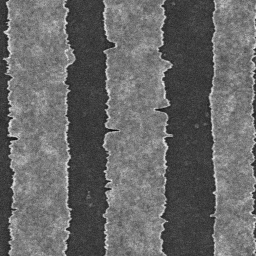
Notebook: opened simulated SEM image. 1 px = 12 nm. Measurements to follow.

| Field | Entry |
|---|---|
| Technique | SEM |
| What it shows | one or a few lines or trenches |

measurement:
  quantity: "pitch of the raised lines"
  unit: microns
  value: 1.16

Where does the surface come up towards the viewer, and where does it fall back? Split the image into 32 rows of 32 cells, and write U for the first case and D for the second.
DUUUUUUUDDDDDUUUUUUUDDDDDDDUUUUU
DUUUUUUUDDDDDUUUUUUUUDDDDDDUUUUU
DUUUUUUUDDDDDUUUUUUUUDDDDDDUUUUU
DUUUUUUUDDDDDUUUUUUUDDDDDDDUUUUU
DUUUUUUUDDDDDUUUUUUUDDDDDDDUUUUU
DUUUUUUUUDDDDDUUUUUUDDDDDDDUUUUU
DUUUUUUUUDDDDUUUUUUUDDDDDDDUUUUU
DUUUUUUUUDDDDUUUUUUUUDDDDDDUUUUU
DUUUUUUUDDDDDUUUUUUUUDDDDDDUUUUU
DUUUUUUUDDDDDUUUUUUUDDDDDDDUUUUU
DUUUUUUUDDDDDUUUUUUUDDDDDDDUUUUU
DUUUUUUUDDDDDUUUUUUUUDDDDDUUUUUU
DUUUUUUUDDDDDDUUUUUUUDDDDDUUUUUU
DUUUUUUUDDDDDUUUUUUUDDDDDDUUUUUU
DUUUUUUUDDDDDUUUUUUUUDDDDDUUUUUU
DUUUUUUUDDDDDUUUUUUUUDDDDDDUUUUU
DUUUUUUUDDDDDDUUUUUUUDDDDDDUUUUU
DDUUUUUUDDDDDUUUUUUUUDDDDDDUUUUU
DUUUUUUUUDDDDUUUUUUUUDDDDDDUUUUU
DUUUUUUUUDDDDDUUUUUUUDDDDDDUUUUU
DUUUUUUUDDDDDUUUUUUUUDDDDDDUUUUU
DDUUUUUUDDDDDUUUUUUUUDDDDDDUUUUU
DDUUUUUUDDDDDUUUUUUUUDDDDDDUUUUU
DDUUUUUUDDDDDDUUUUUUUDDDDDDUUUUU
DDUUUUUUDDDDDUUUUUUUUDDDDDDUUUUU
DDUUUUUUDDDDDDUUUUUUUDDDDDDUUUUU
DDUUUUUUUDDDDUUUUUUUDDDDDDDUUUUU
DUUUUUUUUDDDDUUUUUUUDDDDDDDUUUUU
DUUUUUUUDDDDDUUUUUUUDDDDDDDUUUUU
DUUUUUUUUDDDDUUUUUUUDDDDDDDUUUUU
DUUUUUUUDDDDDUUUUUUUDDDDDDDUUUUU
DUUUUUUUDDDDDUUUUUUUDDDDDDDUUUUU